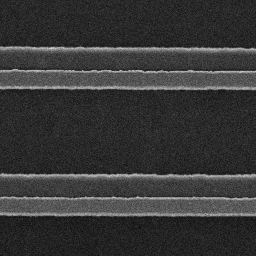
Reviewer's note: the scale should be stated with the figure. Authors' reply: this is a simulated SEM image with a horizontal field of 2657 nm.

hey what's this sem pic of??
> lines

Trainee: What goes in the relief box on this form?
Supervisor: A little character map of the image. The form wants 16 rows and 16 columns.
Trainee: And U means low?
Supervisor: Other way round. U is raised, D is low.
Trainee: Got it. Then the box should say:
DDDDDDDDDDDDDDDD
DDDDDDDDDDDDDDDD
DDDDDDDDDDDDDDDD
UUUUUUUUUUUUUUUU
UUUUUUUUUUUUUUUU
UUUDUUUUUUUUUUUU
DDDDDDDDDDDDDDDD
DDDDDDDDDDDDDDDD
DDDDDDDDDDDDDDDD
DDDDDDDDDDDDDDDD
DDDDDDDDDDDDDDDD
UUUUUUUUUUUUUUUU
UUUUUUUUUUUUUUUU
DDDDDDDDDDDDDDDD
DDDDDDDDDDDDDDDD
DDDDDDDDDDDDDDDD